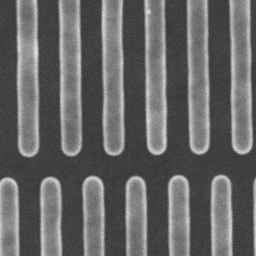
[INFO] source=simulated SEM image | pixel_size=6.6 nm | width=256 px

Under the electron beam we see groups of lines, slits or small figures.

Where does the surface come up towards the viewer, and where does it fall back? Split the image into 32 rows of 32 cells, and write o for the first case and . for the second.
..ooo..ooo...oo...ooo...oo...oo.
..ooo..ooo...oo...oo....oo...oo.
..ooo...oo...oo...ooo...oo...oo.
..ooo...oo...oo...ooo...oo...oo.
..ooo...oo...oo...ooo...oo...oo.
..ooo...oo...oo...ooo...oo...oo.
..ooo...oo...oo...ooo...oo...oo.
..ooo...oo...oo...ooo...oo...oo.
..ooo...oo...oo...ooo...oo...oo.
..ooo...oo...oo...ooo...oo...oo.
..ooo...oo...oo...ooo...oo...oo.
..ooo...oo...oo...ooo...oo...oo.
..ooo...oo...oo...ooo...oo...oo.
..ooo...oo...oo...ooo...oo...oo.
..ooo...oo...oo...ooo...oo...oo.
..ooo...oo...oo...ooo...oo...oo.
..ooo...oo...oo...ooo...oo...oo.
..ooo...oo...oo...ooo...oo...ooo
..ooo...oo...oo....oo...oo...oo.
...o............................
................................
................................
oo....o....o....oo...oo....oo...
oo...ooo..ooo...oo...oo...ooo...
oo...ooo..ooo...oo...oo...ooo...
oo...ooo..ooo...oo...oo...ooo...
oo...ooo..ooo...oo...ooo..ooo...
oo...ooo...oo...oo...ooo..ooo...
oo...oo....oo...oo...ooo..ooo...
oo...ooo...oo...oo...ooo..ooo...
oo...ooo...oo...oo...ooo...oo...
oo...ooo...oo...oo...ooo...oo...